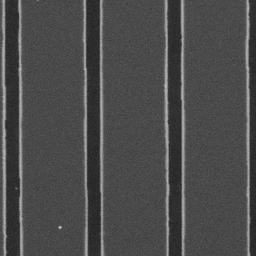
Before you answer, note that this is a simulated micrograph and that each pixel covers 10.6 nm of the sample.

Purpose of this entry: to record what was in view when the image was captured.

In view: lines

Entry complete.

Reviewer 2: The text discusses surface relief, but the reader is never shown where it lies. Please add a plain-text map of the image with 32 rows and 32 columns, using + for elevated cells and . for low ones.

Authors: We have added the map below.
..+++++++++..++++++++..++++++++.
..+++++++++..++++++++..++++++++.
..+++++++++..++++++++..++++++++.
..+++++++++..++++++++..++++++++.
+.+++++++++..++++++++..++++++++.
+.+++++++++..++++++++..++++++++.
..+++++++++..++++++++..++++++++.
..+++++++++..++++++++..++++++++.
..+++++++++..++++++++..++++++++.
..+++++++++..++++++++..++++++++.
+.+++++++++..++++++++..++++++++.
+..++++++++..++++++++..++++++++.
+..++++++++..++++++++..++++++++.
+..++++++++..++++++++..++++++++.
+..++++++++..++++++++..++++++++.
+.+++++++++..++++++++..++++++++.
+..++++++++..++++++++..++++++++.
+..++++++++..++++++++..++++++++.
+..++++++++..++++++++..++++++++.
+..++++++++..++++++++..++++++++.
+..++++++++..++++++++..++++++++.
+..++++++++..++++++++..++++++++.
+..++++++++..++++++++..++++++++.
+..++++++++..++++++++..++++++++.
+..++++++++..++++++++..++++++++.
+..++++++++..++++++++..++++++++.
+..++++++++..++++++++..++++++++.
+..++++++++..++++++++..++++++++.
+..++++++++..++++++++..++++++++.
+..++++++++..++++++++..++++++++.
+..++++++++..++++++++..++++++++.
+..++++++++..++++++++..++++++++.